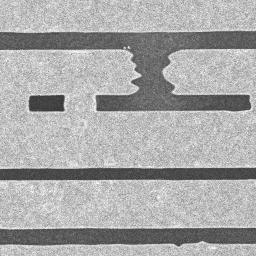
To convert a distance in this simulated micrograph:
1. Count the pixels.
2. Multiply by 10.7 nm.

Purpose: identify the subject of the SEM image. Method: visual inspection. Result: one or a few lines or trenches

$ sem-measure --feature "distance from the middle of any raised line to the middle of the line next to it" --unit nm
703